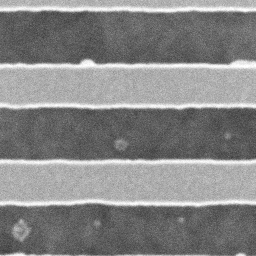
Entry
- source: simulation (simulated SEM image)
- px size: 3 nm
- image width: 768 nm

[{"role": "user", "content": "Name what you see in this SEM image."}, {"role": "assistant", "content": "lines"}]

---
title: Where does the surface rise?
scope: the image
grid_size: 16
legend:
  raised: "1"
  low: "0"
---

1111111111111111
0000000000000000
0000000000000000
0000000000000000
1111111111111111
1111111111111111
1111111111111111
0000000000000000
0000000000000000
0000000000000000
1111111111111111
1111111111111111
1111111111111111
0000000000000000
0000000000000000
0000000000000000